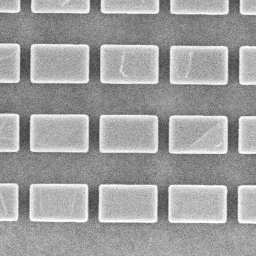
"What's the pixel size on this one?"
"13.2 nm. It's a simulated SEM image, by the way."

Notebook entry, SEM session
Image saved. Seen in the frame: wiring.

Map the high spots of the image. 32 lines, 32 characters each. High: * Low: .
**..*******..*******.*******..**
.*..*******..*******..******..**
................................
................................
................................
................................
**..*******..*******.*******..**
**..*******..*******.*******..**
**..*******..*******.*******..**
**..*******..*******.*******..**
................................
................................
................................
................................
**..*******.....................
**..*******..*******.*******..**
**..*******..*******.*******..**
**..*******..*******.*******..**
**..*******..*******.*******..**
................................
................................
................................
................................
**..*******..*******.*******..**
**..*******..*******.*******..**
**..*******.********.*******..**
**..*******.********.*******..**
.*..*******..******..*******..**
................................
................................
................................
................................